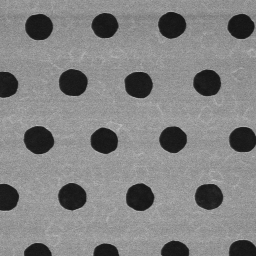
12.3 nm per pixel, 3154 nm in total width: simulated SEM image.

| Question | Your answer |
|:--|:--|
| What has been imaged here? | a regular array of holes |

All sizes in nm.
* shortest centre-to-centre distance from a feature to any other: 805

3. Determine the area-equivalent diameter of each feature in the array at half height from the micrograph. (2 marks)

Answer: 0.336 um